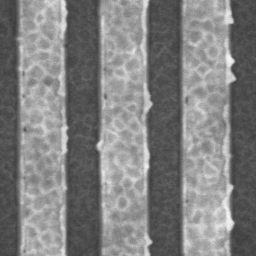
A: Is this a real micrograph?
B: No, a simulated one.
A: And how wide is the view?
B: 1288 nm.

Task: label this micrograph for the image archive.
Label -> one or a few lines or trenches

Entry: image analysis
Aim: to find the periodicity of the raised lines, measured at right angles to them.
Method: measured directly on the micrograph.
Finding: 0.412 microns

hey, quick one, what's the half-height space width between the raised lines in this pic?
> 172 nm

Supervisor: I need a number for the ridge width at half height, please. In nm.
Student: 242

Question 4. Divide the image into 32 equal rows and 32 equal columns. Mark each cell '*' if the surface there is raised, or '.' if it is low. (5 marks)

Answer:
..******....******.....******...
..******....******.....******...
..******....******.....******...
..******....******.....******...
..******....******.....******...
..******....******.....******...
..******....******.....******...
..******.....*****.....******...
..******.....*****.....******...
..******....******.....******...
..******....******.....******...
..******....******.....******...
..******....*******....******...
..******.....******....******...
..******.....*****.....******...
..******....******.....******...
..******.....*****.....******...
..******....******.....******...
..******....*******....******...
..******.....******....******...
..******.....******....******...
..******.....*****.....******...
..******.....*****.....******...
..******.....*****.....******...
..******.....*****.....******...
..******.....*****.....******...
..******.....*****.....******...
..******.....*****.....******...
..******.....*****.....******...
...*****.....******....******...
...*****.....******....******...
..******.....******....******...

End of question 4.